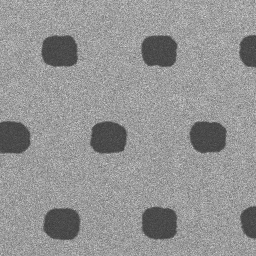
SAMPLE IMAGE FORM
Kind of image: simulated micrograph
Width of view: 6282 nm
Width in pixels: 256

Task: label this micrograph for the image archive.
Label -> holes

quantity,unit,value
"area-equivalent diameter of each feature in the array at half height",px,35.6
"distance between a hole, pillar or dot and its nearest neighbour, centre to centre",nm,2410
